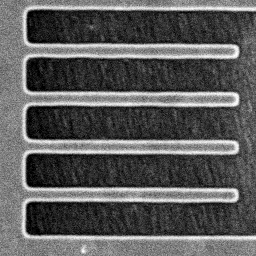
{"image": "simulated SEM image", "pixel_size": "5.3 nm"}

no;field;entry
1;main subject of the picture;groups of lines, slits or small figures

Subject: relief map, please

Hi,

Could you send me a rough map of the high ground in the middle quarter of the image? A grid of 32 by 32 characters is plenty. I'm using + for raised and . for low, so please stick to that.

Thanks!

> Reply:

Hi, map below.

................................
................................
................................
................................
................................
................................
................................
++++++++++++++++++++++++++++++++
++++++++++++++++++++++++++++++++
++++++++++++++++++++++++++++++++
................................
................................
................................
................................
................................
................................
................................
................................
................................
++++++++++++++++++++++++++++++++
++++++++++++++++++++++++++++++++
++++++++++++++++++++++++++++++++
................................
................................
................................
................................
................................
................................
................................
................................
................................
++++++++++++++++++++++++++++++++